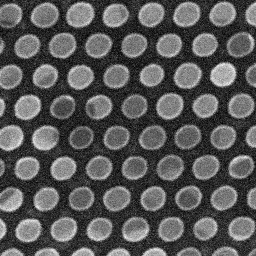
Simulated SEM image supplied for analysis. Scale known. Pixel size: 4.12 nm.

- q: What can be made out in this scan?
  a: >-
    a regular array of raised bodies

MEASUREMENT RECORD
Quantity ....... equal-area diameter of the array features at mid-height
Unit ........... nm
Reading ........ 97.8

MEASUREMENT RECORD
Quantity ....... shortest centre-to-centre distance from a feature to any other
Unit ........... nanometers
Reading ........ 144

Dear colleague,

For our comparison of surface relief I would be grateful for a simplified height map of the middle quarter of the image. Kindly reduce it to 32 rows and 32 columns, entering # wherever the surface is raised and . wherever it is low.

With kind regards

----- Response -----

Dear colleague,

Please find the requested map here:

....#........#.......##......###
..#####....#####....####....####
.######...######...######...####
.######...######...######...####
.######...#####.....####....####
..###......###...............###
................................
................................
##.....####.....####....#####...
###...#####....######...######..
###...######...######..#######..
##....######...######..######...
##....#####....#####....#####...
.......##................##.....
................................
................................
...####....#####....#####....###
..#####...######....#####...####
..#####...######...######...####
..#####...######...######...####
..####.....####.....####.....###
................................
................................
#.......##......###......####...
##.....####....#####....######..
###...######...######...######..
###...######...#####...#######..
##....#####....#####....#####...
#......###......##.......###....
................................
................................
...####.....####.....####....###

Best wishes